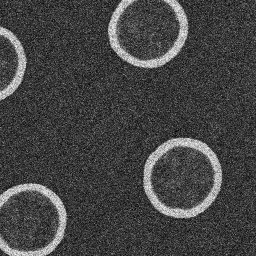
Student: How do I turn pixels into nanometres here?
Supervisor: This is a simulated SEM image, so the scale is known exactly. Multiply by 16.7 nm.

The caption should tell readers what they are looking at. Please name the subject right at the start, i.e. raised bodies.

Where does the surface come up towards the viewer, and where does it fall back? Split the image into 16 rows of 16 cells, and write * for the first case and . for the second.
........***.....
.......****.....
*......****.....
*.......***.....
*...............
*...............
................
................
................
..........***...
.........*****..
.........*****..
***.......***...
****............
****............
***.............